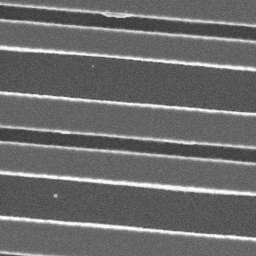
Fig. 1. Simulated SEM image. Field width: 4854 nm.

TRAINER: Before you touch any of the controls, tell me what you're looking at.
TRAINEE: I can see lines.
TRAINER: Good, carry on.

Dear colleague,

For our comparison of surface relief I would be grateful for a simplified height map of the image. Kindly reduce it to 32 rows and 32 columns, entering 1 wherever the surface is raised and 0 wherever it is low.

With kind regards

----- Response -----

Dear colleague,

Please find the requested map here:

11111111111111111111111111111111
00000000000011111111111111111111
00000000000000000000000111111111
11111111111000000000000000000000
11111111111111111111111100000000
11111111111111111111111111111111
00000001111111111111111111111111
00000000000000000001111111111111
00000000000000000000000000000011
00000000000000000000000000000000
00000000000000000000000000000000
00000000000000000000000000000000
11111111110000000000000000000000
11111111111111111111100000000000
11111111111111111111111111111111
11111111111111111111111111111111
00000001111111111111111111111111
00000000000000000001111111111111
11111111100000000000000000000000
11111111111111111111100000000000
11111111111111111111111111111111
11111111111111111111111111111111
00000000000111111111111111111111
00000000000000000000001111111111
00000000000000000000000000000000
00000000000000000000000000000000
00000000000000000000000000000000
11100000000000000000000000000000
11111111111111110000000000000000
11111111111111111111111111100000
11111111111111111111111111111111
11111111111111111111111111111111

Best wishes